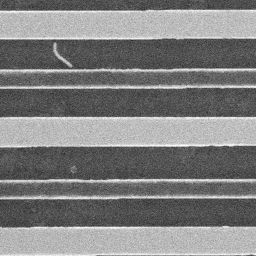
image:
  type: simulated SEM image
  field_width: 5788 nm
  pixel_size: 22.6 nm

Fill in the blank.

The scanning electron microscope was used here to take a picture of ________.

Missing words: lines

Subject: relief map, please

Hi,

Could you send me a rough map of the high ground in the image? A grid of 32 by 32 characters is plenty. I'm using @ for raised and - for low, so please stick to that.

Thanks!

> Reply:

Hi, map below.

--------------------------------
@-@@@@@@@@@@@@@@@@@@@@@@@@@@@@@@
@@@@@@@@@@@@@@@@@@@@@@@@@@@@@@@@
@@@@@@@@@@@@@@@@@@@@@@@@@@@@@@@@
@@@@@@@@@@@@@@@@@@@@@@@@@@@@@@@@
--------------------------------
--------------------------------
--------------------------------
--------------------------------
@@@@@@@@@@@@@@@@@@@@@@@@@@@@@@@@
@@@@@@@@@@@@@@@@@@@@@@@@@@@@@@@@
--------------------------------
--------------------------------
--------------------------------
--------------------------------
@@@@@@@@@@@@@@@@@@@@@@@@@@@@@@@@
@@@@@@@@@@@@@@@@@@@@@@@@@@@@@@@@
@@@@@@@@@@@@@@@@@@@@@@@@@@@@@@@@
--------------------------------
--------------------------------
--------------------------------
--------------------------------
------------------@@@@@@@-@@@@@@
@@@@@@@@@@@@@@@@@@@@@@@@@@@@@@@@
@@@@@@@@@@@@@@@@@@@@@@@@@@@@@@@@
--------------------------------
--------------------------------
--------------------------------
-----@-----@@-@@@@@@@@@@@@@@@@@@
@@@@@@@@@@@@@@@@@@@@@@@@@@@@@@@@
@@@@@@@@@@@@@@@@@@@@@@@@@@@@@@@@
@@@@@@@@@@@@@@@@@@@@@@@@@@@@@@@@